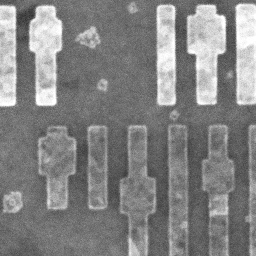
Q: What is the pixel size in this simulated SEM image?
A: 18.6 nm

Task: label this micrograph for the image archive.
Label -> wiring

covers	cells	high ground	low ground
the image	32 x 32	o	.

................................
oo...oo.............oo...oo...oo
oo..ooo.............oo..oooo..oo
oo..oooo............oo..oooo..oo
oo..oooo............oo..oooo..oo
oo..oooo............oo..oooo..oo
oo..ooo.............oo..oooo..oo
oo...oo.............oo...oo...oo
oo...oo.............oo...oo...oo
oo...oo.............oo...oo...oo
oo...oo.............oo...oo...oo
oo...oo.............oo...oo...oo
oo...oo.............oo...oo...oo
................................
................................
................................
......oo...oo...oo...oo...oo...o
.....oooo..oo...oo...oo...oo...o
.....oooo..oo...oo...oo...oo...o
.....oooo..oo...oo...oo...oo...o
.....oooo..oo...oo...oo..oooo..o
.....oooo..oo...oo...oo..oooo..o
......oo...oo..oooo..oo..oooo..o
......oo...oo..oooo..oo...ooo..o
......oo...oo..oooo..oo...oo...o
......oo...oo..oooo..oo...oo...o
...............oooo..oo...oo...o
................oo...oo...oo...o
................oo...oo...oo...o
................oo...oo...oo...o
................oo...oo...oo...o
................oo...oo...oo...o